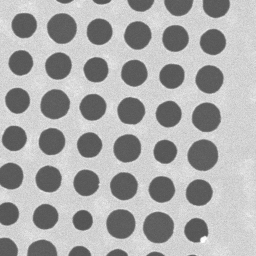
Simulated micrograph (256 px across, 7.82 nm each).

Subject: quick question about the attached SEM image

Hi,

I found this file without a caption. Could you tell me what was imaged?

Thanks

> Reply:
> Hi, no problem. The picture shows a regular array of holes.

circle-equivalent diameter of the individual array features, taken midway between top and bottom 0.21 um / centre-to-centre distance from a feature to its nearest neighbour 0.294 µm